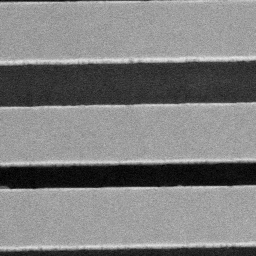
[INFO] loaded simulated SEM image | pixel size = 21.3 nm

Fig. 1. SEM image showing lines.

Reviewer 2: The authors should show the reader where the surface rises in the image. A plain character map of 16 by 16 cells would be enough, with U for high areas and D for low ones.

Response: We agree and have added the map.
UUUUUUUUUUUUUUUU
UUUUUUUUUUUUUUUU
UUUUUUUUUUUUUUUU
UUUUUUUUUUUUUUUU
DDDDDDDDDDDDDDDD
DDDDDDDDDDDDDDDD
DDDDDDDDDDDUUUUU
UUUUUUUUUUUUUUUU
UUUUUUUUUUUUUUUU
UUUUUUUUUUUUUUUU
DDDDDDDDDDDDDDDD
DDDDDDDDDDDDDDDD
UUUUUUUUUUUUUUUU
UUUUUUUUUUUUUUUU
UUUUUUUUUUUUUUUU
UUUUUUUUDDDDDDDD